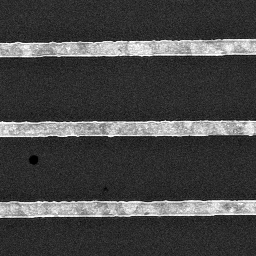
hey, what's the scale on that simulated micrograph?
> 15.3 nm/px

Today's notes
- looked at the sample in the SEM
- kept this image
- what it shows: lines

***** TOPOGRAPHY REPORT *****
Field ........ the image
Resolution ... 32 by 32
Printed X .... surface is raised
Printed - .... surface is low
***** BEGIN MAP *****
--------------------------------
--------------------------------
--------------------------------
--------------------------------
--------------------------------
-XXXXXXXXXXXXXXXXXXXXXXXXXXXXXXX
XXXXXXXXXXXXXXXXXXXXXXXXXXXXXXXX
--------------------------------
--------------------------------
--------------------------------
--------------------------------
--------------------------------
--------------------------------
--------------------------------
--------------------------------
XXXXXXXXXXXXXXXXXXXXXXXXXXXXXXXX
XXXXXXXXXXXXXXXXXXXXXXXXXXXXXXXX
--------------------------------
--------------------------------
--------------------------------
--------------------------------
--------------------------------
--------------------------------
--------------------------------
--------------------------------
XXXXXXXXXXXXXXXXXXXXXXXXXXXXXXXX
XXXXXXXXXXXXXXXXXXXXXXXXXXXXXXXX
--------------------------------
--------------------------------
--------------------------------
--------------------------------
--------------------------------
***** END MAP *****